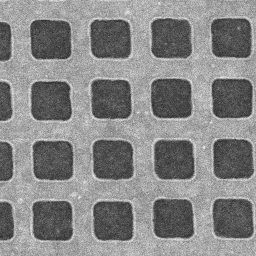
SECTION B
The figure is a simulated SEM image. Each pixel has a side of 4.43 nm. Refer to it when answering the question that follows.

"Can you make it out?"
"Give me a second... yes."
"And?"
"a regular array of holes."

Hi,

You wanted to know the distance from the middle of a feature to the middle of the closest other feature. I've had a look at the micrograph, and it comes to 266 nm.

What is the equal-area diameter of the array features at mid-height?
202 nm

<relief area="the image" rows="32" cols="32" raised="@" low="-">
@@@@@@@@@@@@@@@@@@@@@@@@@@@@@@@@
@@@@@@@@@@@@@@@@@@@@@@@@@@@@@@@@
@@@@----@@@@----@@@----@@@@----@
-@@@-----@@-----@@@-----@@-----@
-@@@-----@@------@@-----@@------
--@@-----@@------@@-----@@------
--@@-----@@-----@@@-----@@------
-@@@@---@@@@@@@@@@@@@@@@@@@@@@@@
@@@@@@@@@@@@@@@@@@@@@@@@@@@@@@@@
@@@@@@@@@@@@@@@@@@@@@@@@@@@@@@@@
-@@@-----@@-----@@@-----@@------
--@@-----@@-----@@@-----@@------
--@@-----@@------@@-----@@------
--@@-----@@------@@-----@@------
--@@-----@@@----@@@-----@@@----@
@@@@@@@@@@@@@@@@@@@@@@@@@@@@@@@@
@@@@@@@@@@@@@@@@@@@@@@@@@@@@@@@@
@@@@@---@@@@---@@@@@----@@@----@
--@@-----@@------@@-----@@@-----
--@@-----@@------@@-----@@@-----
--@@-----@@@-----@@-----@@@-----
--@@-----@@@-----@@-----@@@-----
-@@@@----@@@@---@@@@----@@@@@@@@
@@@@@@@@@@@@@@@@@@@@@@@@@@@@@@@@
@@@@@@@@@@@@@@@@@@@@@@@@@@@@@@@@
-@@@-----@@@----@@@-----@@@-----
--@@-----@@------@@-----@@------
--@@-----@@@-----@@-----@@------
--@@-----@@@-----@@-----@@@-----
--@@-----@@@-----@@@----@@@----@
@@@@@@@@@@@@@@@@@@@@@@@@@@@@@@@@
@@@@@@@@@@@@@@@@@@@@@@@@@@@@@@@@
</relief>